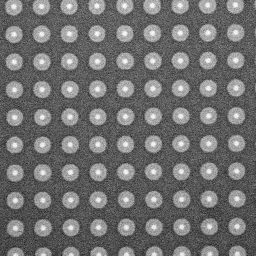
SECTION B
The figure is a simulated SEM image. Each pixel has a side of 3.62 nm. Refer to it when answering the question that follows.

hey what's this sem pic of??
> an array of small figures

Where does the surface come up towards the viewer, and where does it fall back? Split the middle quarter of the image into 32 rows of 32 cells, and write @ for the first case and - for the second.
@@@---@@@@---@@@@---@@@@----@@@-
--------------------------------
--------------------------------
--------------------------------
@@-----@@-----@@@----@@@----@@@-
@@@---@@@@---@@@@---@@@@---@@@@-
@@@@--@@@@---@@@@---@@@@---@@@@-
@@@----@@@----@@@----@@@---@@@@-
--------------------------------
--------------------------------
--------------------------------
@@@----@@@----@@@----@@@----@@@-
@@@---@@@@---@@@@---@@@@---@@@@-
@@@@--@@@@---@@@@---@@@@---@@@@-
@@@----@@@----@@@----@@@----@@@-
--------------------------------
--------------------------------
--------------------------------
@@@----@@@----@@@----@@@----@@@-
@@@@--@@@@@--@@@@---@@@@---@@@@-
@@@@--@@@@@--@@@@---@@@@---@@@@-
@@@----@@@----@@@----@@@----@@@-
--------------------------------
--------------------------------
--------------------------------
@@@----@@@----@@@----@@@----@@@-
@@@@---@@@@--@@@@@--@@@@---@@@@-
@@@@---@@@@--@@@@@--@@@@---@@@@-
@@@----@@@----@@@----@@@----@@@-
--------------------------------
--------------------------------
--------------------------------